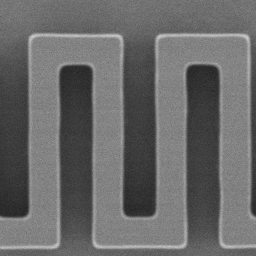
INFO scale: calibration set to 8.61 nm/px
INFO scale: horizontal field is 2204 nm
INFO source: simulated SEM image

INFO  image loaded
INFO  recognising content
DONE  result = groups of lines, slits or small figures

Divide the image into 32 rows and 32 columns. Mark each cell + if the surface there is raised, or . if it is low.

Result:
................................
................................
................................
................................
....+++++++++++.....+++++++++++.
....+++++++++++.....+++++++++++.
....+++++++++++.....+++++++++++.
....+++++++++++.....+++++++++++.
....++++...++++.....+++....++++.
....+++.....+++.....+++.....+++.
....+++.....+++.....+++.....+++.
....+++.....+++.....+++.....+++.
....+++.....+++.....+++.....+++.
....+++.....+++.....+++.....+++.
....+++.....+++.....+++.....+++.
....+++.....+++.....+++.....+++.
....+++.....+++.....+++.....+++.
....+++.....+++.....+++.....+++.
....+++.....+++.....+++.....+++.
....+++.....+++.....+++.....+++.
....+++.....+++.....+++.....+++.
....+++.....+++.....+++.....+++.
....+++.....+++.....+++.....+++.
....+++.....+++.....+++.....+++.
....+++.....+++.....+++.....+++.
....+++.....+++.....+++.....+++.
....+++.....+++....++++.....+++.
+++++++.....+++++++++++.....++++
+++++++.....+++++++++++.....++++
+++++++.....+++++++++++.....++++
+++++++.....+++++++++++.....++++
................................